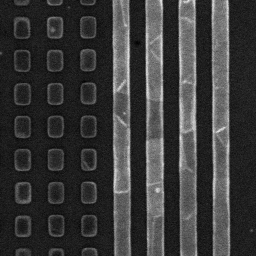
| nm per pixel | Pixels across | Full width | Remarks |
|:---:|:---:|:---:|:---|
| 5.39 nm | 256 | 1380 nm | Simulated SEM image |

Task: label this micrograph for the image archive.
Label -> wiring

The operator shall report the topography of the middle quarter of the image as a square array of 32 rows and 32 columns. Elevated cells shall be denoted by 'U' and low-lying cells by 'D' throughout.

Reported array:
DDDDUUUUDDDDDUUUDDDDDUUUDDDDDUUU
DDDDDUUDDDDDDUUUDDDDDUUUDDDDDUUU
DDDDDDDDDDDDUUUUDDDDDUUUDDDDDUUU
DDDDDDDDDDDDUUUUDDDDDUUUUDDDDUUU
DDDDDDDDDDDDDUUUDDDDDUUUUDDDDUUU
DDDDUUUUDDDDDUUUDDDDDUUUUDDDDUUU
DDDDUUUUDDDDDUUUDDDDDUUUUDDDDUUU
DDDDUUUUDDDDDUUUDDDDDUUUDDDDDUUU
DDDDUUUUDDDDDUUUDDDDDUUUDDDDDUUU
DDDDDUUDDDDDDUUUDDDDDUUUDDDDDUUU
DDDDDDDDDDDDUUUUDDDDDUUUDDDDDUUU
DDDDDDDDDDDDUUUUDDDDDUUUDDDDDUUU
DDDDDDDDDDDDUUUUDDDDDUUUDDDDDUUU
DDDDDUUUDDDDUUUUDDDDDUUUDDDDDUUU
DDDDUUUUDDDDDUUUDDDDDUUUDDDDDUUU
DDDDUUUUDDDDDUUUDDDDDUUUUDDDDUUU
DDDDUUUUDDDDDUUUDDDDDUUUUDDDDUUU
DDDDUUUUDDDDDUUUDDDDDUUUUDDDDUUU
DDDDDDDDDDDDDUUUDDDDDUUUUDDDDUUU
DDDDDDDDDDDDDUUUDDDDDUUUUDDDDUUU
DDDDDDDDDDDDDUUUDDDDDUUUUDDDDUUU
DDDDDUUDDDDDDUUUDDDDDUUUUDDDDUUU
DDDDUUUUDDDDDUUUDDDDDUUUUDDDDUUU
DDDDUUUUDDDDDUUUDDDDDUUUUDDDDUUU
DDDDUUUUDDDDDUUUDDDDDUUUUDDDDUUU
DDDDUUUUDDDDDUUUDDDDDUUUUDDDDUUU
DDDDDUUDDDDDDUUUDDDDDUUUUDDDDUUU
DDDDDDDDDDDDDUUUDDDDDUUUUDDDDUUU
DDDDDDDDDDDDDUUUDDDDDUUUUDDDDUUU
DDDDDDDDDDDDDUUUDDDDDUUUUDDDDUUU
DDDDUUUUDDDDDUUUDDDDDUUUUDDDDUUU
DDDDUUUUDDDDDUUUDDDDDUUUUDDDDUUU